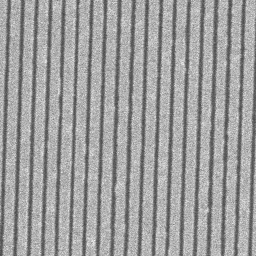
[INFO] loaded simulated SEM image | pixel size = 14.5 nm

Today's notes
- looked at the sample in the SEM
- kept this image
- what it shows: parallel lines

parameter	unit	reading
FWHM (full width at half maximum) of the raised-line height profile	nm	147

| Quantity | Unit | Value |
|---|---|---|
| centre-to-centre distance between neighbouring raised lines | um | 0.201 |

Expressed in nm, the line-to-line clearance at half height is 54.4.